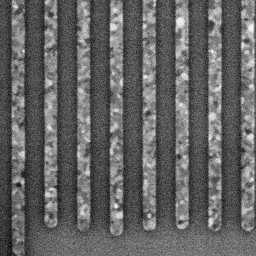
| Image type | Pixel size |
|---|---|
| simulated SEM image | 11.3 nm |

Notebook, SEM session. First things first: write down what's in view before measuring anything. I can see groups of lines, slits or small figures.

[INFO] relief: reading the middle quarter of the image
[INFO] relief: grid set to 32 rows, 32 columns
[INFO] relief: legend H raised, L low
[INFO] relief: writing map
LLLLHHLLLLLLHHHLLLLLHHHLLLLLHHHL
LLLLHHLLLLLLHHHLLLLLHHHLLLLLHHHL
LLLLHHLLLLLLHHHLLLLLHHHLLLLLHHHL
LLLLHHLLLLLLHHHLLLLLHHHLLLLLHHHL
LLLHHHLLLLLLHHHLLLLLHHHLLLLLHHHL
LLLHHHLLLLLLHHHLLLLLHHHLLLLLHHHL
LLLHHHLLLLLLHHHLLLLLHHHLLLLLHHHL
LLLHHHLLLLLLHHHLLLLLHHHLLLLLHHHL
LLLHHHLLLLLLHHHLLLLLHHHLLLLLHHHL
LLLHHHLLLLLLHHHLLLLLHHHLLLLLHHHL
LLLHHHLLLLLLHHHLLLLLHHHLLLLLHHHL
LLLLHHLLLLLLHHHLLLLLHHHLLLLLHHHL
LLLLHHLLLLLLHHHLLLLLHHHLLLLLHHHL
LLLHHHLLLLLLHHHLLLLLHHHLLLLLHHHL
LLLHHHLLLLLLHHHLLLLLHHHLLLLLHHHL
LLLHHHLLLLLLHHHLLLLLHHHLLLLLHHHL
LLLHHHLLLLLLHHHLLLLLHHHLLLLLHHHL
LLLHHHLLLLLLHHHLLLLLHHHLLLLLHHHL
LLLHHHLLLLLLHHHLLLLLHHHLLLLLHHHL
LLLHHHLLLLLLHHHLLLLLHHHLLLLLHHHL
LLLLHHLLLLLLHHHLLLLLHHHLLLLLHHHL
LLLHHHLLLLLLHHHLLLLLHHHLLLLLHHHL
LLLHHHLLLLLLHHHLLLLLHHHLLLLLHHHL
LLLHHHLLLLLLHHHLLLLLHHHLLLLLHHHL
LLLLHHLLLLLLHHHLLLLLHHHLLLLLHHHL
LLLLHHLLLLLLHHHLLLLLHHHLLLLLHHHL
LLLLHHLLLLLLHHHLLLLLHHHLLLLLHHHL
LLLLHHLLLLLLHHHLLLLLHHHLLLLLHHHL
LLLLHHLLLLLLHHHLLLLLHHHLLLLLHHHL
LLLHHHLLLLLLHHHLLLLLHHHLLLLLHHHL
LLLHHHLLLLLLHHHLLLLLHHHLLLLLHHHL
LLLHHHLLLLLLHHHLLLLLHHHLLLLLHHHL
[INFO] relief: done